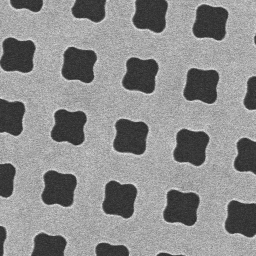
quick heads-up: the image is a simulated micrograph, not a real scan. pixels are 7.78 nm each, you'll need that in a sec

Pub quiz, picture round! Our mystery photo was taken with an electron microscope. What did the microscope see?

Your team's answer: a regular array of holes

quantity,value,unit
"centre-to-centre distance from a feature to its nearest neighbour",61.8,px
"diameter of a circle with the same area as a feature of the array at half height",278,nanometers